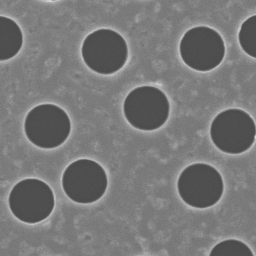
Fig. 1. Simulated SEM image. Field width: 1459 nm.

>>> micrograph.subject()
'a regular array of holes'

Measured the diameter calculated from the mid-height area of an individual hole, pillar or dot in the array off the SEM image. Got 44.4 px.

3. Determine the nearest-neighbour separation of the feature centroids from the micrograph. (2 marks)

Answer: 371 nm